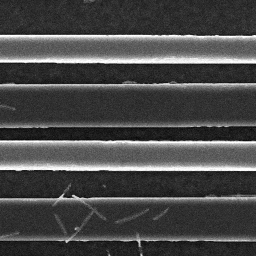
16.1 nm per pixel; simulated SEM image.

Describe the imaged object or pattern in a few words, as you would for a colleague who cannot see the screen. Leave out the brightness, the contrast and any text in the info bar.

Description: lines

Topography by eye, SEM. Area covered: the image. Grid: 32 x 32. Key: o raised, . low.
................................
................................
................................
................................
ooooooo..oooo...o.o.............
oooooooooooooooooooooooooooooooo
oooooooooooooooooooooooooooooooo
oooooooooooooooooooooooooooooooo
................................
................................
................................
oooooooooooooooooooooooooooooooo
oooooooooooooooooooooooooooooooo
oooooooooooooooooooooooooooooooo
oooooooooooooooooooooooooooooooo
oooooooooooooooooooooooooooooooo
................................
................................
oooooooooooooooooooooooooooooooo
oooooooooooooooooooooooooooooooo
oooooooooooooooooooooooooooooooo
................................
................................
................................
................................
oooooooooooooooooooooooooooooooo
oooooooooooooooooooooooooooooooo
oooooooooooooooooooooooooooooooo
oooooooooooooooooooooooooooooooo
oooooooooooooooooooooooooooooooo
................................
................................